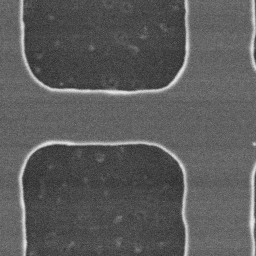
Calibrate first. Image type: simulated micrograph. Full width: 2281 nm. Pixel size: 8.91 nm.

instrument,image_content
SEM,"holes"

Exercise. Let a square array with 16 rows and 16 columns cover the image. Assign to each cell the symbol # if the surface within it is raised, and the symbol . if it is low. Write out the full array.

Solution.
#...........####
#...........####
#...........####
##..........####
##.........#####
###.......######
################
################
################
##........######
##.........#####
#...........####
#..........#####
##.........#####
##..........####
##..........####